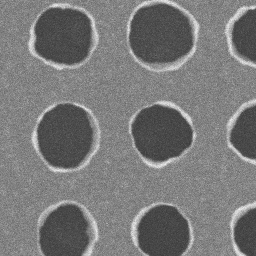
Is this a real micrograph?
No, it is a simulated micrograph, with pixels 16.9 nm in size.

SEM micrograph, holes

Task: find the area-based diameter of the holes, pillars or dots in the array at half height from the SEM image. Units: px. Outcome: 62.4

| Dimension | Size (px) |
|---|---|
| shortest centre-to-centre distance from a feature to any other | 95.7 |